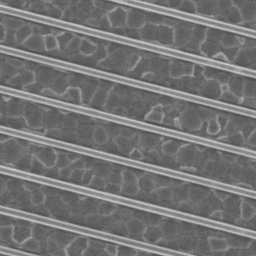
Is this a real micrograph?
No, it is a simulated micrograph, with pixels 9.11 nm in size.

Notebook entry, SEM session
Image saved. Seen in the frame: parallel lines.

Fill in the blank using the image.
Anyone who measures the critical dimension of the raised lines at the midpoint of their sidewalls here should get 60.7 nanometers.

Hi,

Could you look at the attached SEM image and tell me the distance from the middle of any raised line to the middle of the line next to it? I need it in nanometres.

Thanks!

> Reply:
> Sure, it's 354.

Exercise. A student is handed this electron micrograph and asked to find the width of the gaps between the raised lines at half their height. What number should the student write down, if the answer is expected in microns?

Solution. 0.295